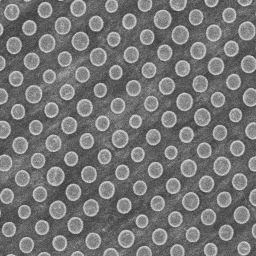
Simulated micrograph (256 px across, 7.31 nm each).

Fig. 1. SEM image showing a regular array of raised bodies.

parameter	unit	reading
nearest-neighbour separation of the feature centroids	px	23.4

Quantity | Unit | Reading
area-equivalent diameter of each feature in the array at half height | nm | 110